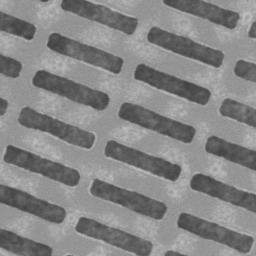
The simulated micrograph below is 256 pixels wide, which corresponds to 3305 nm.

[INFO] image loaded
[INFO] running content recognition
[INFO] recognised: a regular array of holes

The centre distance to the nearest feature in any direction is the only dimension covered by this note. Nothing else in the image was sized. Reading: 519 nanometres